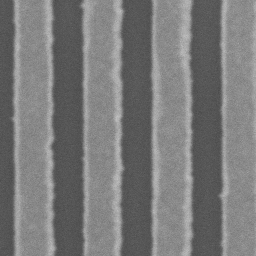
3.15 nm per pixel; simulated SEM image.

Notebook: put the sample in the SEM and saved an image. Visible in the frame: lines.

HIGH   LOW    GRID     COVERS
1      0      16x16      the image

0110011100110011
0110011000110011
0110011000110011
0110011000110011
0110011000110011
0110011000110011
0110011000110011
0110011000110011
0110011000110011
0110011000110011
0110011100110011
0110011000110011
0110011000110011
0110011100110011
0110011100110011
0110011000110011